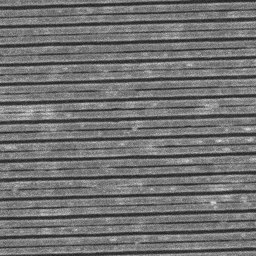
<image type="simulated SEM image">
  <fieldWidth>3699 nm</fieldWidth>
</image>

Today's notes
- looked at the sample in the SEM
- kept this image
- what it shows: parallel lines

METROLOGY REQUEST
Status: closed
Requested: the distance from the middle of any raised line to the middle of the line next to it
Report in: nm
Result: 138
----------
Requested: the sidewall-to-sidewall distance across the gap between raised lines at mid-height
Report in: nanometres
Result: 54.1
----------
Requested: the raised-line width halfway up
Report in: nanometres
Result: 93.9